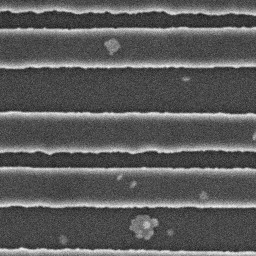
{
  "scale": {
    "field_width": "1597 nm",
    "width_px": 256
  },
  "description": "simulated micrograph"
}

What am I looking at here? lines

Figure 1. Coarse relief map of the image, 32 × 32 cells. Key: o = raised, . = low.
oooooooooooooooooooooooooooooooo
..o.o....ooooooooo...ooooooooooo
................................
......................oo....o.oo
oooooooooooooooooooooooooooooooo
oooooooooooooooooooooooooooooooo
oooooooooooooooooooooooooooooooo
oooooooooooooooooooooooooooooooo
................................
................................
................................
................................
................................
................................
oooooooooooooooooooooooooooooooo
oooooooooooooooooooooooooooooooo
oooooooooooooooooooooooooooooooo
oooooooooooooooooooooooooooooooo
oooooooooooooooooooooooooooooooo
................................
................................
oooooooooooooooooooooooooooooooo
oooooooooooooooooooooooooooooooo
oooooooooooooooooooooooooooooooo
oooooooooooooooooooooooooooooooo
oooooooooooooooooooooooooooooooo
................................
................................
.................oo.............
................................
................................
ooooooooooooooooooooooo.........